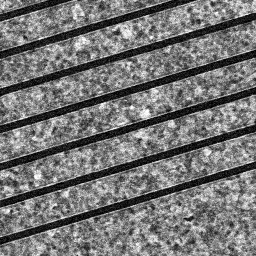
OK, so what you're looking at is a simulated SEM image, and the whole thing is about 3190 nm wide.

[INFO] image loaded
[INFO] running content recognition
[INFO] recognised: parallel lines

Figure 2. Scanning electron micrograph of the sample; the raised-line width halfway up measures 340 nanometres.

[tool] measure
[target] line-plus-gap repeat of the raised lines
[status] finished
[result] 443 nm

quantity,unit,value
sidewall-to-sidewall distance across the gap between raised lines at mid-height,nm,97.1